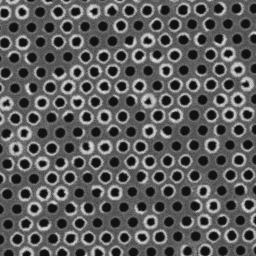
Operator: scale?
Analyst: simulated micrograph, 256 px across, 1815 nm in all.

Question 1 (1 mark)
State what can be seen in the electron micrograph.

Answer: a regular array of holes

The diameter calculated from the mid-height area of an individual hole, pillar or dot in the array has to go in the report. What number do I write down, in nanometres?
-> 69.7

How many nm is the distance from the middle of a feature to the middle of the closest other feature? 122